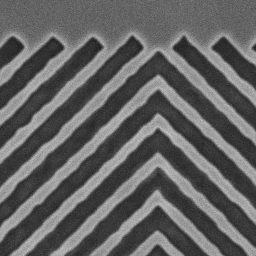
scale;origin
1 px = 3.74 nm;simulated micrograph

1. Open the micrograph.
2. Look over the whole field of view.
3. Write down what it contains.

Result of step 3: groups of lines, slits or small figures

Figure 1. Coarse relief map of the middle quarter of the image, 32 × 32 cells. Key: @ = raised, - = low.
-----@@@@------@@@@---------@@@@
-----@@@------@@@@-----------@@@
---@@@@------@@@@-------------@@
---@@@------@@@@-------@-------@
-@@@@------@@@@------@@@@-------
@@@@------@@@@------@@@@@@------
@@@------@@@@------@@@@-@@@-----
@@------@@@@------@@@@---@@@----
@------@@@@------@@@@-----@@@---
------@@@@------@@@@-------@@@@-
-----@@@@------@@@@---------@@@@
----@@@@------@@@@-----------@@@
---@@@@-------@@@-------------@@
--@@@@------@@@--------@@------@
-@@@@------@@@--------@@@@------
@@@@------@@@@------@@@@@@@-----
@@@------@@@@------@@@@-@@@@----
@@------@@@@------@@@@---@@@@---
@------@@@-------@@@-------@@@--
------@@@@------@@@--------@@@@-
-----@@@-------@@@----------@@@@
----@@@@------@@@-------------@@
---@@@@------@@@-------@------@@
--@@@-------@@@-------@@@------@
-@@@-------@@@@------@@@@@------
@@@@------@@@-------@@@@@@@-----
@@@------@@@-------@@@---@@@----
@-------@@@-------@@@@----@@@---
-------@@@-------@@@-------@@@--
------@@@------@@@@---------@@@-
-----@@@------@@@@-----------@@@
----@@@------@@@@@-----------@@@